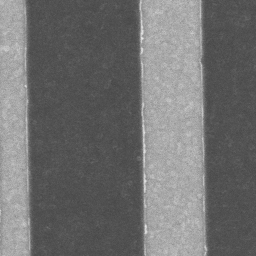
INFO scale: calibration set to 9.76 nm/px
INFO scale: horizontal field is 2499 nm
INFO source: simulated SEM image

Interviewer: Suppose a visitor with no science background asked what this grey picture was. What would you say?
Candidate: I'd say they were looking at one or a few lines or trenches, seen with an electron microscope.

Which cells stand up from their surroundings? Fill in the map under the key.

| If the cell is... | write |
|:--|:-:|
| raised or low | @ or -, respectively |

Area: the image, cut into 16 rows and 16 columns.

--@@@@@@@---@@@@
--@@@@@@@----@@@
--@@@@@@@----@@@
--@@@@@@@----@@@
--@@@@@@@----@@@
--@@@@@@@----@@@
--@@@@@@@----@@@
--@@@@@@@----@@@
--@@@@@@@----@@@
--@@@@@@@----@@@
--@@@@@@@----@@@
--@@@@@@@----@@@
--@@@@@@@----@@@
--@@@@@@@----@@@
--@@@@@@@----@@@
--@@@@@@@----@@@